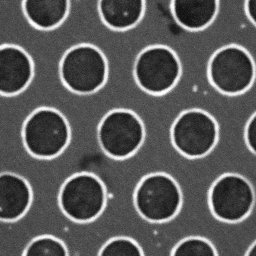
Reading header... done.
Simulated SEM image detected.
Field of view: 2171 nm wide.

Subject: a regular array of holes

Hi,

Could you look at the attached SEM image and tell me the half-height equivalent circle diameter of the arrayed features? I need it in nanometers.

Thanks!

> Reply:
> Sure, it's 372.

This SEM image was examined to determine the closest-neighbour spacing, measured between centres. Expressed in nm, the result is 623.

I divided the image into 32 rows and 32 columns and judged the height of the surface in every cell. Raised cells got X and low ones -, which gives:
XXX-----XXXXX-----XXXX-----XXXX-
XXX-----XXXXX-----XXXX-----XXXX-
XXXX----XXXXX----XXXXX----XXXXXX
XXXXXXXXXXXXXXXXXXXXXXXX-XXXXXXX
XXXXXXXXXXXXXXXXXXXXXXXXXXXXXXXX
XXXXXXXXXXXXXXXXXXXXXXXXXXXXXXXX
---XXXXXX---XXXXXX---XXXXXX---XX
----XXXX-----XXXX-----XXXXX----X
----XXXX-----XXXX-----XXXX------
----XXXX-----XXXX-----XXXX------
---XXXXX-----XXXXX----XXXXX----X
--XXXXXXXX-XXXXXXXX-XXXXXXXX-XXX
XXXXXXXXXXXXXXXXXXXXXXXXXXXXXXXX
XXXXXXXXXXXXXXXXXXXXXXXXXXXXXXXX
XXXX----XXXXXX---XXXXXX---XXXXXX
XXX-----XXXXX-----XXXX-----XXXX-
XXX-----XXXX------XXXX-----XXXX-
XXX-----XXXXX-----XXXX-----XXXX-
XXXX----XXXXX----XXXXX----XXXXX-
XXXXX-XXXXXXXX--XXXXXXXXXXXXXXXX
XXXXXXXXXXXXXXXXXXXXXXXXXXXXXXXX
XXXXXXXXXXXXXXXXXXXXXXXXXXXXXXXX
---XXXXXX---XXXXXX---XXXXXXX--XX
---XXXXX-----XXXX-----XXXXX----X
----XXXX-----XXXX-----XXXX------
----XXXX-----XXXX-----XXXXX----X
---XXXXX----XXXXXX----XXXXX----X
XXXXXXXXXXXXXXXXXXX-XXXXXXXX--XX
XXXXXXXXXXXXXXXXXXXXXXXXXXXXXXXX
XXXXXXXXXXXXXXXXXXXXXXXXXXXXXXXX
XXXX----XXXXXX---XXXXXX---XXXXXX
XXX-----XXXXX----XXXXX-----XXXX-